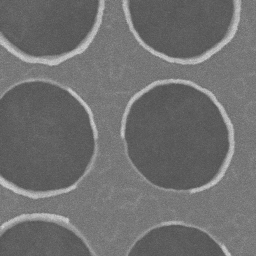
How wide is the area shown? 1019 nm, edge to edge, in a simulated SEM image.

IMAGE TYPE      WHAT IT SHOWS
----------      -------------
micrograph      holes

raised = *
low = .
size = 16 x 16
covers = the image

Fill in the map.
......**.......*
......**......**
.....****.....**
**..*******..***
****************
*...******..****
.....***.....***
......**......**
......**......**
......**......**
......***.....**
*....*****...***
****************
****************
.....****....***
......**......**